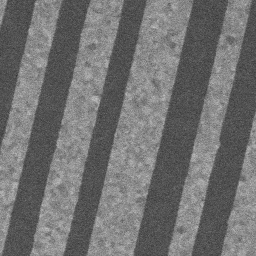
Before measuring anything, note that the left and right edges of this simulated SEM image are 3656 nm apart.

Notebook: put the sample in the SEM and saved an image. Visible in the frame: one or a few lines or trenches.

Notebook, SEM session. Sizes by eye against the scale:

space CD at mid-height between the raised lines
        407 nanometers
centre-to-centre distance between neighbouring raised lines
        900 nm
